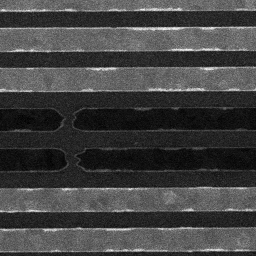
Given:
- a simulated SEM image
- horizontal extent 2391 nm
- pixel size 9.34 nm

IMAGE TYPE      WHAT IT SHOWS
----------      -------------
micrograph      parallel lines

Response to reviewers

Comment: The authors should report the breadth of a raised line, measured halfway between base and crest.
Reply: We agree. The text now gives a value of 220 nanometers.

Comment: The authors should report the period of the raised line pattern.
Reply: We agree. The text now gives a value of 0.374 microns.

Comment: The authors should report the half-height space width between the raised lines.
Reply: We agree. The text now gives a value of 156 nm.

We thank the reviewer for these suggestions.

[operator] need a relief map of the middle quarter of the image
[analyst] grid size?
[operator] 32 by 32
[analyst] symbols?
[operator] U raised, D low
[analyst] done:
DDDDDDDDDDDDDDDDDDDDDDDDDDDDDDDD
UUUUUUUUUUUUUUUUUUUUUUUUUUUUUUUU
UUUUUUUUUUUUUUUUUUUUUUUUUUUUUUUU
UUUUUUUUUUUUUUUUUUUUUUUUUUUUUUUU
UUUUUUUUUUUUUUUUUUUUUUUUUUUUUUUU
UUUUUUUUUUUUUUUUUUUUUUUUUUUUUUUU
UUUUUUUUUUUUUUUUUUUUUUUUUUUUUUUU
DDDDDDDDDDDDDDDDDDDDDDDDDDDDDDDD
DDDDDDDDDDDDDDDDDDDDDDDDDDDDDDDD
DDDDDDDDDDDDDDDDDDDDDDDDDDDDDDDD
DDDDDDDDDDDDDDDDDDDDDDDDDDDDDDDD
DDDDUUUUUUUUUUUUUUUUUUUUUUUUUUUU
DDDUUUUUUUUUUUUUUUUUUUUUUUUUUUUU
DDDUUUUUUUUUUUUUUUUUUUUUUUUUUUUU
DDUUUUUUUUUUUUUUUUUUUUUUUUUUUUUU
DDUUUUUUUUUUUUUUUUUUUUUUUUUUUUUU
DDDDUUUUUUUUUUUUUUUUUUUUUUUUUUUU
DDDDDDDDDDDDDDDDDDDDDDDDDDDDDDDD
DDDDDDDDDDDDDDDDDDDDDDDDDDDDDDDD
DDDDDDDDDDDDDDDDDDDDDDDDDDDDDDDD
DDDDDDDDDDDDDDDDDDDDDDDDDDDDDDDD
DDDDDUUUUUUUUUUUUUUUUUUUUUUUUUUU
DDDDUUUUUUUUUUUUUUUUUUUUUUUUUUUU
DDDUUUUUUUUUUUUUUUUUUUUUUUUUUUUU
UDDDUUUUUUUUUUUUUUUUUUUUUUUUUUUU
UDDDUUUUUUUUUUUUUUUUUUUUUUUUUUUU
DDDDDUUUUUUUUUUUUUUUUUUUUUUUUUUU
DDDDDDDDDDDDDDDDDDDDDDDDDDDDDDDD
DDDDDDDDDDDDDDDDDDDDDDDDDDDDDDDD
DDDDDDDDDDDDDDDDDDDDDDDDDDDDDDDD
DDDDDDDDDDDDDDDDDDDDDDDDDDDDDDDD
UUUUUUUUUUUUUUUUUUUUUUUUUUUUUUUU